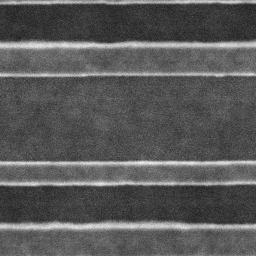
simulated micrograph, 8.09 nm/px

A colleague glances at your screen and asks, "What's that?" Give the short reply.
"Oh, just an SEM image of lines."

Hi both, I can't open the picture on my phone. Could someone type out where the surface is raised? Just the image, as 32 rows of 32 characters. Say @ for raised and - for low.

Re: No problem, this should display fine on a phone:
--------------------------------
--------------------------------
--------------------------------
--------------------------------
--------------------------------
--------------------------------
@@@@@@@@@@@@@@@@@@@@@@@@@@@@@@@@
@@@@@@@@@@@@@@@@@@@@@@@@@@@@@@@@
@@@@@@@@@@@@@@@@@@@@@@@@@@@@@@@@
--------------------------------
--------------------------------
--------------------------------
--------------------------------
--------------------------------
--------------------------------
--------------------------------
--------------------------------
--------------------------------
--------------------------------
--------------------------------
@@@@@@@@@@@@@@@@@@@@@@@@@@@@@@@@
@@@@@@@@@@@@@@@@@@@@@@@@@@@@@@@@
@@@@@@@@@@@@@@@@@@@@@@@@@@@@@@@@
--------------------------------
--------------------------------
--------------------------------
--------------------------------
--------------------------------
@@@@@@@@@@@@@@@@@@@@@@@@@@@@@@@@
@@@@@@@@@@@@@@@@@@@@@@@@@@@@@@@@
@@@@@@@@@@@@@@@@@@@@@@@@@@@@@@@@
@@@@@@@@@@@@@@@@@@@@@@@@@@@@@@@@